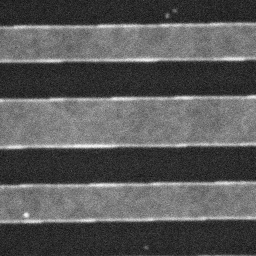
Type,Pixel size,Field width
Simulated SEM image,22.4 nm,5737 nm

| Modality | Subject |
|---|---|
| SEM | lines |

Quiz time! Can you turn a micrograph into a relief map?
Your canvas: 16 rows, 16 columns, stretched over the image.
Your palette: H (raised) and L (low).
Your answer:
LLLLLLLLLLLLLLLL
LLLLLLLLLLLLLHHH
HHHHHHHHHHHHHHHH
HHHHHHHHHHHHHHHH
LLLLLLLLLLLLLLLL
LLLLLLLLLLLLLLLL
HHHHHHHHHHHHHHHH
HHHHHHHHHHHHHHHH
HHHHHHHHHHHHHHHH
LLLLLLLLLLLLLLLL
LLLLLLLLLLLLLLLL
LLLLLLLLLHHHHHHH
HHHHHHHHHHHHHHHH
HHHHHHHHHHHHHHHH
LLLLLLLLLLLLLLLL
LLLLLLLLLLLLLLLL